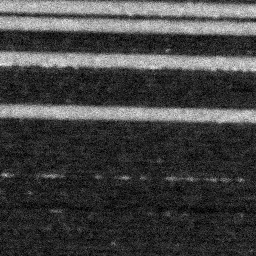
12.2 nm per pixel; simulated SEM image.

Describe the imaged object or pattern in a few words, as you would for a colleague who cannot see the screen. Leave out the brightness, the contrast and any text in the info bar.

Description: parallel lines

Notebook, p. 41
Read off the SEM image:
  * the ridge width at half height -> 11.7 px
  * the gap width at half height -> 71.8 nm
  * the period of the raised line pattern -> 0.215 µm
